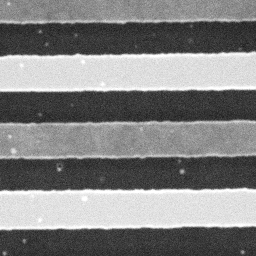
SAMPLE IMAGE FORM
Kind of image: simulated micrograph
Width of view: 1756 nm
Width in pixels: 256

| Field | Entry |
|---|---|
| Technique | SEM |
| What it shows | lines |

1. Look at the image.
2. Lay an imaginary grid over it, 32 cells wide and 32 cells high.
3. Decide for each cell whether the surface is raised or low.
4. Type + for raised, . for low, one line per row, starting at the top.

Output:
++++++++++++++++++++++++++++++++
++++++++++++++++++++++++++++++++
++++++++++++++++++++++++++++++++
................................
................................
................................
................................
++++++++++++++++++++++++++++++++
++++++++++++++++++++++++++++++++
++++++++++++++++++++++++++++++++
++++++++++++++++++++++++++++++++
................................
................................
................................
................................
.+..++++++++++++++++++++++++++++
++++++++++++++++++++++++++++++++
++++++++++++++++++++++++++++++++
++++++++++++++++++++++++++++++++
++++++++++++++++++++++++++.+++..
................................
................................
................................
................................
++++++++++++++++++++++++++++++++
++++++++++++++++++++++++++++++++
++++++++++++++++++++++++++++++++
++++++++++++++++++++++++++++++++
++++++++++...+..................
................................
................................
................................